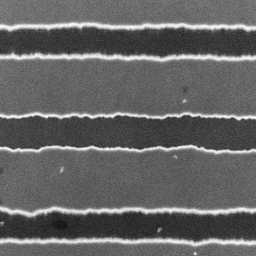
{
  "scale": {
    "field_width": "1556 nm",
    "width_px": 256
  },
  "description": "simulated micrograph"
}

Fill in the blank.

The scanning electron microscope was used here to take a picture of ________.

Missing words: lines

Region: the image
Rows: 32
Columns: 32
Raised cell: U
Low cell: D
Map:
UUUUUUUUUUUUUUUUUUUUUUUUUUUUUUUU
UUUUUUUUUUUUUUUUUUUUUUUUUUUUUUUU
UUUUUUUUUUUUUUUUUUUUUUUUUUUUUUUU
DUDDDDDDDDDDDDDDDDDDDDDDDDDDDDDU
DDDDDDDDDDDDDDDDDDDDDDDDDDDDDDDD
DDDDDDDDDDDDDDDDDDDDDDDDDDDDDDDD
DDDDDDDDDDDDDDDDDDDDDDDDDDDDDDDD
UUUUUUUUUUUUUUUUUUUUUUUUUUUUUUUU
UUUUUUUUUUUUUUUUUUUUUUUUUUUUUUUU
UUUUUUUUUUUUUUUUUUUUUUUUUUUUUUUU
UUUUUUUUUUUUUUUUUUUUUUUUUUUUUUUU
UUUUUUUUUUUUUUUUUUUUUUUUUUUUUUUU
UUUUUUUUUUUUUUUUUUUUUUUUUUUUUUUU
UUUUUUUUUUUUUUUUUUUUUUUUUUUUUUUU
UUUUDUUUUDUUUUDDUUUUUUUDUUUUUUUU
DDDDDDDDDDDDDDDDDDDDDDDDDDDDDDDD
DDDDDDDDDDDDDDDDDDDDDDDDDDDDDDDD
DDDDDDDDDDDDDDDDDDDDDDDDDDDDDDDD
UDDDDUUUUDDUDDDDDDDUUDUUUDDDDDDD
UUUUUUUUUUUUUUUUUUUUUUUUUUUUUUUU
UUUUUUUUUUUUUUUUUUUUUUUUUUUUUUUU
UUUUUUUUUUUUUUUUUUUUUUUUUUUUUUUU
UUUUUUUUUUUUUUUUUUUUUUUUUUUUUUUU
UUUUUUUUUUUUUUUUUUUUUUUUUUUUUUUU
UUUUUUUUUUUUUUUUUUUUUUUUUUUUUUUU
UUUUUUUUUUUUUUUUUUUUUUUUUUUUUUUU
DDUUUDDDDDDDDDDDDDDDDDDDDUUDDDDD
DDDDDDDDDDDDDDDDDDDDDDDDDDDDDDDD
DDDDDDDDDDDDDDDDDDDDDDDDDDDDDDDD
DDDDDDDDDDDDDDDDDDDDDDDDDDDDDDDD
UUUUUUUUUUUUUUUUUUUUUUUUDUUUUUUU
UUUUUUUUUUUUUUUUUUUUUUUUUUUUUUUU